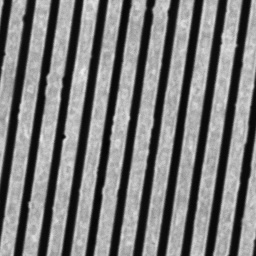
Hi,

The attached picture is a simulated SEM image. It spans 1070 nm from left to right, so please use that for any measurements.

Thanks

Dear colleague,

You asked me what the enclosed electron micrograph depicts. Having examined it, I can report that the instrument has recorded parallel lines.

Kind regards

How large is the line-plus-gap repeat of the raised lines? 98.9 nm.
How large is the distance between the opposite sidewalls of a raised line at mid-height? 64.6 nm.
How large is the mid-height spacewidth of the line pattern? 34.1 nm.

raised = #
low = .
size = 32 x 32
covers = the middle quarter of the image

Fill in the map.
...###...###..####...###...###..
..####..####..####..####..####..
..####..####..####..####..####..
..####..####..####..####..####..
..####..####..####..####..####..
..####..####..####..####..####..
..####..###..####...###..####...
..###...###..####...###..####..#
.####..####..####..####..####..#
.####..####..####..####..####..#
.####..####..####..####..####..#
.####..####..####..####..####..#
.####..####..####..####..###...#
####...###..####..####...###...#
####...###..####..####..####..##
####..####..####..####..####..##
####..####..####..####..####..##
####..####..####..####..####..##
####..####.#####..####..####..##
####..####..####..###...###...##
###...###..####..####...###...##
###...###..####..####..####..###
###..####..####..####..####..###
###..####..####..####..####..###
###..####..####..####..####..###
###..####..####..####..####..###
###..###...###..####...###...###
##...###...###..####...###..####
##..####..####..####..####..####
##..####..####..####..####..####
##..####..####..####..####..####
##..####..####..####..####..####